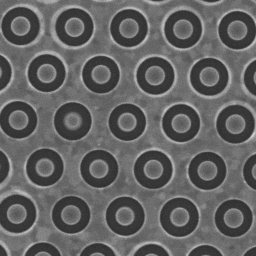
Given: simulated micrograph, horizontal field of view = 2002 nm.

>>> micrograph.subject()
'an array of small figures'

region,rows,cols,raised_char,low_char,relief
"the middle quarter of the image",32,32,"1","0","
11111000010000111100000000011111
01110000111000111100011110001111
01110001111000111100011110001110
11110001111000111100011110001110
11111000010000111100011100001111
11111000000001111110000000011111
11111100000011111110000000111111
11111111101111111111100001111111
11111111111111111111111111111111
11011111111111111111111111111111
00000111111110000011111111100000
00000011111100000001111111000000
00000001111100010000111110000000
01110001111000111100011100001110
01110001111000111100011100011111
01100001111000111100011100011111
00000001111100011000111110001110
00000011111100000000111110000000
00000111111110000011111111000000
11111111111111111111111111110011
11111111111111111111111111111111
11111111001111111111100011111111
11111100000011111110000000111111
11111000000001111100000000011111
11110001110001111100011100011110
11110001111000111000111100011110
11110001111000111000111110001110
11110001110001111000111100011110
11111000000001111100001000011110
11111000000011111100000000111111
11111110000111111111000001111111
11111111111111111111111111111111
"